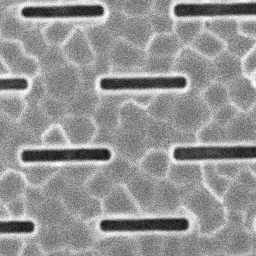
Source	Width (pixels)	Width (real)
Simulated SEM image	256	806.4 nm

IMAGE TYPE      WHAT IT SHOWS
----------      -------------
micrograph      holes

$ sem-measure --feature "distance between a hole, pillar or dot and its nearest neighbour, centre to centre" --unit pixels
106